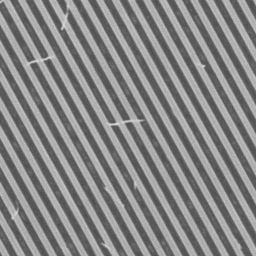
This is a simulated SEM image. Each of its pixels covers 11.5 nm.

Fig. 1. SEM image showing parallel lines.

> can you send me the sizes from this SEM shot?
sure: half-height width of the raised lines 70.6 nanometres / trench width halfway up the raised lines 0.0908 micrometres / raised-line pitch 158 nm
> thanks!